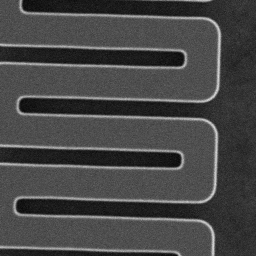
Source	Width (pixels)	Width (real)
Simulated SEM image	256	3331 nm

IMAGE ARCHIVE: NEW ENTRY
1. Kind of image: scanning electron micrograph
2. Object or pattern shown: groups of lines, slits or small figures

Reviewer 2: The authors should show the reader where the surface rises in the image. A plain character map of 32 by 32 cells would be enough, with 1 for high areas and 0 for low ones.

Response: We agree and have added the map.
11100000000000000000000000000000
11110000000000000000000000000000
11111111111111111111111111000000
11111111111111111111111111100000
11111111111111111111111111100000
11111111111111111111111111100000
00000000000000000000000111100000
00000000000000000000000111100000
11111111111111111111111111100000
11111111111111111111111111100000
11111111111111111111111111100000
11111111111111111111111111100000
11100000000000000001111111000000
11000000000000000000000000000000
11111111111100000000000000000000
11111111111111111111111111000000
11111111111111111111111111100000
11111111111111111111111111100000
00000001111111111111111111100000
00000000000000000000000111100000
10000000000000000000000111100000
11111111111111111111111111100000
11111111111111111111111111100000
11111111111111111111111111100000
11111111111111111111111111000000
11000000000000000000000000000000
11000000000000000000000000000000
11111111111111111111111000000000
11111111111111111111111111000000
11111111111111111111111111100000
11111111111111111111111111100000
00000000000000000000111111100000